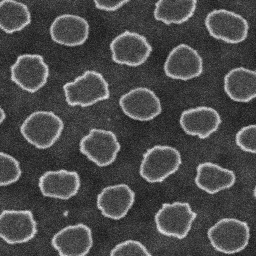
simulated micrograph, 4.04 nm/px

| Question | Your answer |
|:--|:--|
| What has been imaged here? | a regular array of raised bodies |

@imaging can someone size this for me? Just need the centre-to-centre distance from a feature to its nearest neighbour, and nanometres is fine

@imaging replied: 227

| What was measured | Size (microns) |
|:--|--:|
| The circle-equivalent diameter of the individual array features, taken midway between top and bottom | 0.143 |